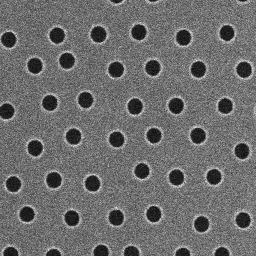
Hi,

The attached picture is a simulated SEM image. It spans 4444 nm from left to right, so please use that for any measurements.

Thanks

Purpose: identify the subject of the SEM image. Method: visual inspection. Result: a regular array of holes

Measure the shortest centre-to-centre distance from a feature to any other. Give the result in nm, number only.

646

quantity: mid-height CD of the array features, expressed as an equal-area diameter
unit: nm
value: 274